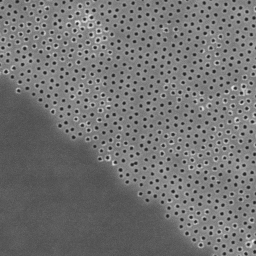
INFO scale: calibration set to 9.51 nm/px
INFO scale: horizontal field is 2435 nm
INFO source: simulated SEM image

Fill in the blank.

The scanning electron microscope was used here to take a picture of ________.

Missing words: a regular array of holes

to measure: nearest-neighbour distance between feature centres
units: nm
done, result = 72.2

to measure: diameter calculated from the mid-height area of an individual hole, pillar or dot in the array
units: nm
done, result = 35.6